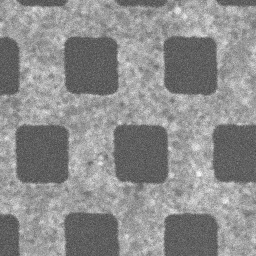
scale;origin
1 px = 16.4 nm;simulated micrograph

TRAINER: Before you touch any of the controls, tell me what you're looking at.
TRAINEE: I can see holes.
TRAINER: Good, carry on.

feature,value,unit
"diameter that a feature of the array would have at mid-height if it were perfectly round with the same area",1030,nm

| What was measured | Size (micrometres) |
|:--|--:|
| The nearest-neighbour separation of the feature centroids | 1.63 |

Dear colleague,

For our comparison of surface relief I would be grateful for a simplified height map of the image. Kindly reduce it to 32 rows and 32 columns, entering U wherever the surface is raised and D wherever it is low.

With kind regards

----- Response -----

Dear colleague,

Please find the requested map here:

UUDDDDDDUUUUUUUDDDDDDUUUUUUDDDDD
UUUUUUUUUUUUUUUUUUUUUUUUUUUUUUUU
UUUUUUUUUUUUUUUUUUUUUUUUUUUUUUUU
UUUUUUDUUUUUUUUUUUUUUUUUUUUUUUUU
UUUUUUDDUDUUUUUUUUUUUUDDDDUUUUUU
DDUUUUUUDDDDDDDUUUUUDDDDDDDUUUUU
DDUUUUUUDDDDDDDUUUUUDDDDDDDUUUUU
DDDUUUUUDDDDDDDUUUUUDDDDDDDUUUUU
DDDUDUUUDDDDDDDUUUUUDDDDDDDUUUUU
DDDUUUUUDDDDDDDUUUUUDDDDDDDUUUUU
DDDUUUUUDDDDDDDUUUUUDDDDDDDUUUUU
DDUUUUUUUDDDDDDUUUUUUDDDDDDUUUUU
UUUUUUUUUUUUUUUUUUUUUUUUUUUUUUUU
UUUUUUUUUUUUUUUUUUUUUUUUUUUUUDUU
UUUUUUUUUUUUUUUUUUUUUUUUUUUUUUUU
UUUDUUUUUUUUUUUDUUUUUUUUUUUUDDDD
UUDDDDDDDUUUUUDDDDDDDUUUUUUDDDDD
UUDDDDDDDUUUUUDDDDDDDUUUUUUDDDDD
UUDDDDDDDUUUUUDDDDDDDUUUUUUDDDDD
UUDDDDDDDUUUUUDDDDDDDUUUUUUDDDDD
UUDDDDDDDUUUUUDDDDDDDUUUUUUDDDDD
UUDDDDDDDUUUUUDDDDDDDUUUUUUDDDDD
UUDDDDDDUUUUUUUDDDDDDUUUUUUDDDDD
UDUUUUUUUUUUUUUUUUUUUUUUUUUUUUUU
UUUUUUUUUUUUUUUUUUUUUUUUUUUUUUUU
UUUUUUUUUUUUUUUUUUUUUUUUUUUUUUUU
DUUUUUUUUDDUUUUUUUUUUUUUUUUUUUUU
DDUUUUUUDDDDDDDUUUUUDDDDDDDUUUUU
DDDUUUUUDDDDDDDUUUUUDDDDDDDUUUUU
DDDUUUUUDDDDDDDUUUUUDDDDDDDUUUUU
DDDUUUUUDDDDDDDUUUUUDDDDDDDUUUUU
DDDUUUUUDDDDDDDUUUUUDDDDDDDUUUUU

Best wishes